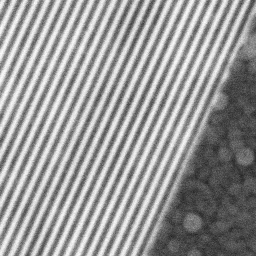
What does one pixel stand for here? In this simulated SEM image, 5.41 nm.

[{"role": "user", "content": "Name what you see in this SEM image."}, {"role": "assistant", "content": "parallel lines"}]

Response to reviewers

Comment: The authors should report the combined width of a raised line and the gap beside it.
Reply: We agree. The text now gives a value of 0.055 micrometres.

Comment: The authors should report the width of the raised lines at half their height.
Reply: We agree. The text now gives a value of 19.8 nm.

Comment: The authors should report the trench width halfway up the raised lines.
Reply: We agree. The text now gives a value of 34.6 nanometers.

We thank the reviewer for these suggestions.